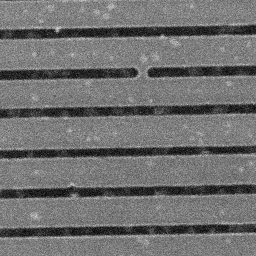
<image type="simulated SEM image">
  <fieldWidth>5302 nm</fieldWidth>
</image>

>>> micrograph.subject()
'parallel lines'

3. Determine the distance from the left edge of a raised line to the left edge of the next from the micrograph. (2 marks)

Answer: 0.821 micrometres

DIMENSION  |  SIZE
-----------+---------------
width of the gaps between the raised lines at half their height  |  215 nanometers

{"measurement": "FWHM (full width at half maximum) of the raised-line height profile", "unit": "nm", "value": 603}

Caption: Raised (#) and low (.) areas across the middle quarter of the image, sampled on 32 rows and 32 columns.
##########################..####
...................##...........
...................##...........
..................###....##.####
################################
################################
################################
################################
################################
################################
#########.......................
.......................#........
................................
################################
################################
################################
################################
################################
################################
################################
#############################...
................................
................................
....###..#######################
################################
################################
################################
################################
################################
################################
#..#########........#...........
................................